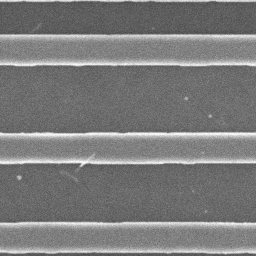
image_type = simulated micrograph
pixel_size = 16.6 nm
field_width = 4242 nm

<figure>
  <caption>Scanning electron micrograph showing lines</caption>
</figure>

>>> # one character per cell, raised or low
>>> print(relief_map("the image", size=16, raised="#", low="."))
................
................
################
################
................
................
................
................
################
################
................
................
................
................
################
################